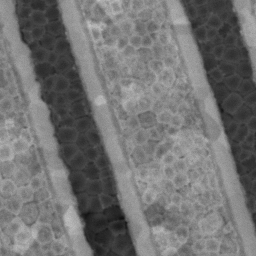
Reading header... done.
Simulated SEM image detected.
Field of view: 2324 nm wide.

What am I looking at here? one or a few lines or trenches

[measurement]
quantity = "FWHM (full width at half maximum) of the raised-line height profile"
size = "944 nanometers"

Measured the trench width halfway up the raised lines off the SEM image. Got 0.535 µm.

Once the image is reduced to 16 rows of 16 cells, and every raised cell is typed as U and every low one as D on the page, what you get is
DDDDUUUUUUUDDDDU
UDDDDUUUUUUDDDDD
UDDDDUUUUUUUDDDD
UDDDDUUUUUUUDDDD
UUDDDUUUUUUUDDDD
UUDDDDUUUUUUUDDD
UUDDDDUUUUUUUDDD
UUUDDDDUUUUUUDDD
UUUDDDDUUUUUUUDD
UUUDDDDUUUUUUUDD
UUUUDDDUUUUUUUDD
UUUUDDDDUUUUUUUD
UUUUDDDDUUUUUUUD
UUUUUDDDUUUUUUUD
UUUUUDDDDUUUUUUD
UUUUUDDDDUUUUUUU